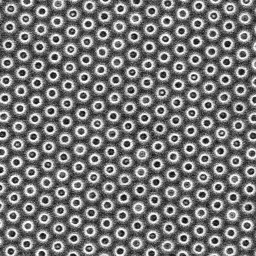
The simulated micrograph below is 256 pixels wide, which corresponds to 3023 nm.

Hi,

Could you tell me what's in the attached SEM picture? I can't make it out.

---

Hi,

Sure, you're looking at a regular array of holes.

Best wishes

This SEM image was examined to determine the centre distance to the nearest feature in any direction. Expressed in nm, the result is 209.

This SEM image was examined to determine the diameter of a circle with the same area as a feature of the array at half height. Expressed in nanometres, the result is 93.3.